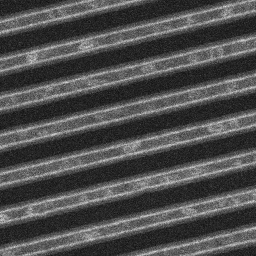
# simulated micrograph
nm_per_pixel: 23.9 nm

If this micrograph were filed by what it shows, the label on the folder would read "parallel lines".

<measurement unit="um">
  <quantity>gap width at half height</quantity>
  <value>0.524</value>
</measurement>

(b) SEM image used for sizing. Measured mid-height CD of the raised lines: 364 nanometres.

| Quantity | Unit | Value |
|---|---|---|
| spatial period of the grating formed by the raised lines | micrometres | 0.887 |